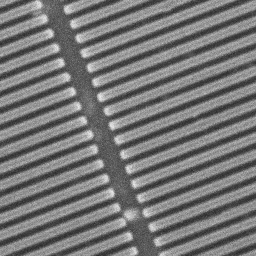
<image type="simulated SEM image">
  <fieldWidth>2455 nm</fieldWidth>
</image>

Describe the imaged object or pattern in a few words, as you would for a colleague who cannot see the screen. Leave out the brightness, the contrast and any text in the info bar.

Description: parallel lines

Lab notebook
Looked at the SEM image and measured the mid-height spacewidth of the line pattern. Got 80.6 nanometers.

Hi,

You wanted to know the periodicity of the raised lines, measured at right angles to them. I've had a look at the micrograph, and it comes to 149 nm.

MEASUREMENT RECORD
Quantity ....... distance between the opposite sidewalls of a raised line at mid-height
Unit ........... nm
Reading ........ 71.6